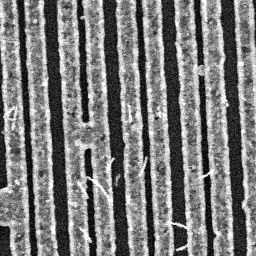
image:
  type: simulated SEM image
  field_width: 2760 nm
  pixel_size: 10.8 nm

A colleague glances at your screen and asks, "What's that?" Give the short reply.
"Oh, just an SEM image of parallel lines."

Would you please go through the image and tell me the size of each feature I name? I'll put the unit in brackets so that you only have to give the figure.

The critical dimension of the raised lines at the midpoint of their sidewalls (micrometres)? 0.156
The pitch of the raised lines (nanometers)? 315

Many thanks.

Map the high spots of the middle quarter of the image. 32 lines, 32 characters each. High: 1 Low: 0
11100011110000111100011100000111
11100011110000111100011110000111
11100001110000111100011110000111
11100011110000011100011110000111
11100001110000011100011110000111
11100001110000011100011110000011
11100001110000011100011110000011
11110001110000011100011110000111
11110001110000011100011110000111
11110001110000011100011110000011
11110001110000011110011110000011
11110001110000011110001110000011
01110001110000011110001110000011
11110001110000011110001110000011
11110001111000011110001110000011
11111111111000011110001110000011
01111111111000011110001110000011
01111111111000011110001110000011
01111111111000011110001110000011
01111111111000001110001111000011
01111101111000001110001111000011
01110000111000011110001111000011
01110000111000001110001111000011
01111001111000001110001111000001
01111001111000001110001111000001
01110000111100001111001111000001
01111000111000001111001111000011
01111000111000001110001111000011
01111000111000001110001111000001
01111001111000001111000111000001
01111000111000001111000111000001
00111000111000001111000111000001